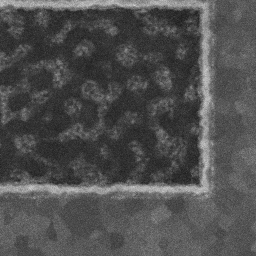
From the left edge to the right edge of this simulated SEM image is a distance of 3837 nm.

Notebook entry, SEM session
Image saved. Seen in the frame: one or a few lines or trenches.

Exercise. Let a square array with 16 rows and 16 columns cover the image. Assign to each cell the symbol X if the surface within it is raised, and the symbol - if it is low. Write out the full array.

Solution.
-------------XXX
-------------XXX
-------------XXX
-------------XXX
-------------XXX
-------------XXX
-------------XXX
-------------XXX
-------------XXX
-------------XXX
-------------XXX
-------------XXX
XXXXXXXXXXXXXXXX
XXXXXXXXXXXXXXXX
XXXXXXXXXXXXXXXX
XXXXXXXXXXXXXXXX